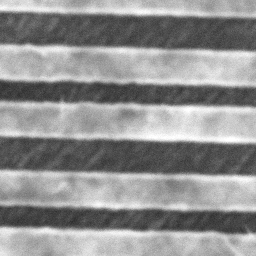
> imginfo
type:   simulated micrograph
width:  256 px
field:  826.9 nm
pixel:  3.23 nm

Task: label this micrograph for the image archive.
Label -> lines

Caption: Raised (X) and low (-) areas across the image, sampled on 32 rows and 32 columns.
XXXXXXXXXXXXXXXXXXXXXXXXXXXXXXXX
----XXXXXXXXXXXXXXXXXXXXXXXXXXXX
--------------------------------
--------------------------------
--------------------------------
--------------------------------
XXXXXXXXXXXXXXXXXXXXXXXXXXXXXXX-
XXXXXXXXXXXXXXXXXXXXXXXXXXXXXXXX
XXXXXXXXXXXXXXXXXXXXXXXXXXXXXXXX
XXXXXXXXXXXXXXXXXXXXXXXXXXXXXXXX
-------------------XXXXXXXXXXXXX
--------------------------------
--------------------------------
XXXXXXXXXXXXXXXXXXXXXXXXXXXXXXXX
XXXXXXXXXXXXXXXXXXXXXXXXXXXXXXXX
XXXXXXXXXXXXXXXXXXXXXXXXXXXXXXXX
XXXXXXXXXXXXXXXXXXXXXXXXXXXXXXXX
-------------------XXXXXXXXXXXXX
--------------------------------
--------------------------------
--------------------------------
XXXXXXX-------------------------
XXXXXXXXXXXXXXXXXXXXXXXXXXXXXXXX
XXXXXXXXXXXXXXXXXXXXXXXXXXXXXXXX
XXXXXXXXXXXXXXXXXXXXXXXXXXXXXXXX
XXXXXXXXXXXXXXXXXXXXXXXXXXXXXXXX
--------------------------------
--------------------------------
XXXX-X--------------------------
XXXXXXXXXXXXXXXXXXXXXXXXXXXXXXXX
XXXXXXXXXXXXXXXXXXXXXXXXXXXXXXXX
XXXXXXXXXXXXXXXXXXXXXXXXXXXXXXXX